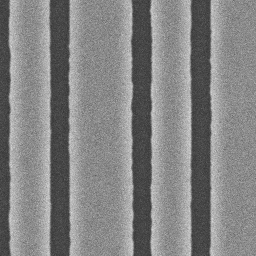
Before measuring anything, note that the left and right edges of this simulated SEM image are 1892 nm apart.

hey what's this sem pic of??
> lines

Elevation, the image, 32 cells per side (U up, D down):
DUUUUUDDDUUUUUUUDDDUUUUUDDUUUUUU
DUUUUUDDDUUUUUUUDDDUUUUUDDUUUUUU
DUUUUUDDDUUUUUUUDDDUUUUUDDUUUUUU
DUUUUUDDDUUUUUUUDDDUUUUUDDUUUUUU
DUUUUUDDDUUUUUUUDDDUUUUUDDUUUUUU
DUUUUUDDDUUUUUUUDDDUUUUUDDUUUUUU
DUUUUUDDDUUUUUUUDDDUUUUUDDUUUUUU
DUUUUUDDDUUUUUUUDDDUUUUUDDUUUUUU
DUUUUUDDDUUUUUUUDDDUUUUUDDUUUUUU
DUUUUUDDDUUUUUUUDDDUUUUUDDUUUUUU
DUUUUUDDDUUUUUUUDDDUUUUUDDUUUUUU
DUUUUUDDDUUUUUUUDDDUUUUUDDUUUUUU
DUUUUUDDDUUUUUUUDDDUUUUUDDUUUUUU
DUUUUUDDDUUUUUUUDDDUUUUUDDUUUUUU
DUUUUUDDDUUUUUUUDDDUUUUUDDDUUUUU
DUUUUUDDDUUUUUUUDDDUUUUUDDUUUUUU
DUUUUUDDDUUUUUUUDDDUUUUUDDUUUUUU
DUUUUUDDDUUUUUUUDDDUUUUUDDUUUUUU
DUUUUUDDDUUUUUUUDDDUUUUUDDUUUUUU
DUUUUUDDDUUUUUUUDDDUUUUUDDUUUUUU
DUUUUUDDDUUUUUUUDDDUUUUUDDUUUUUU
DUUUUUDDDUUUUUUUDDDUUUUUDDUUUUUU
DUUUUUDDDUUUUUUUDDDUUUUUDDUUUUUU
DUUUUUDDDUUUUUUUUDDUUUUUDDUUUUUU
DUUUUUDDDUUUUUUUUDDUUUUUDDUUUUUU
DUUUUUDDDUUUUUUUUDDUUUUUDDUUUUUU
DUUUUUDDDUUUUUUUUDDUUUUUDDUUUUUU
DUUUUUDDDUUUUUUUUDDUUUUUDDUUUUUU
DUUUUUDDDUUUUUUUUDDUUUUUDDUUUUUU
DUUUUUDDDUUUUUUUDDDUUUUUDDUUUUUU
DUUUUUDDDUUUUUUUUDDUUUUUDDUUUUUU
DUUUUUDDDUUUUUUUUDDUUUUUDDUUUUUU